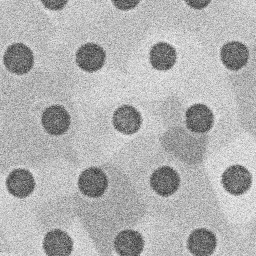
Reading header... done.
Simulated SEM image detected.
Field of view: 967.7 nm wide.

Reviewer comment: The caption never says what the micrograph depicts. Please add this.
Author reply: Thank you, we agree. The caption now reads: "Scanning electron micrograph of a regular array of holes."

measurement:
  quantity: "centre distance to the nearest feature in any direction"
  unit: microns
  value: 0.271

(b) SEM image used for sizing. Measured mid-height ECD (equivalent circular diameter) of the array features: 119 nm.